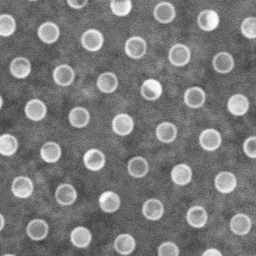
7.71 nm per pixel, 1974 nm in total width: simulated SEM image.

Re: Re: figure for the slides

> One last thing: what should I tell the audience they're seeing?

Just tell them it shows a regular array of raised bodies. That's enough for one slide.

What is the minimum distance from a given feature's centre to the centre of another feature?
0.34 µm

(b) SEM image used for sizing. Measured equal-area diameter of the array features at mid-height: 147 nm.